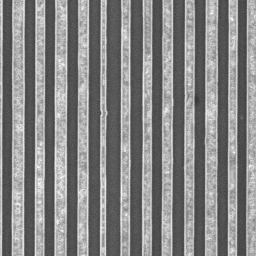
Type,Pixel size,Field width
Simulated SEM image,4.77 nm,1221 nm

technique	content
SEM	parallel lines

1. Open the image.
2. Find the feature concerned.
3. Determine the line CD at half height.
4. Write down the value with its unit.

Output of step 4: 0.0442 microns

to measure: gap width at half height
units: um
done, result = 0.0567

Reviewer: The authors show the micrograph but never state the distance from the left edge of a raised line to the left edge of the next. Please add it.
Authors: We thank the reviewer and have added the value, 102 nm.